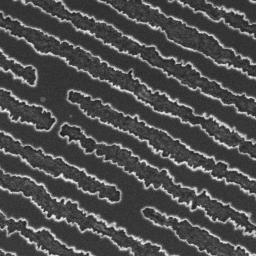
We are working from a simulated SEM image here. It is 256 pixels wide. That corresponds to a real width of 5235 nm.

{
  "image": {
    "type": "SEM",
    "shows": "parallel lines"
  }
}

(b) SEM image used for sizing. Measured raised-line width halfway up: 406 nm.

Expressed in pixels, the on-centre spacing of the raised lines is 34.9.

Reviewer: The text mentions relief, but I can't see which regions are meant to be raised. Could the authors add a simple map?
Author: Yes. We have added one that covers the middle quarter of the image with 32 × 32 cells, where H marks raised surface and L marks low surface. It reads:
HHLLLLLLLLLHHHHHHHHHHHLLLLLLLLLL
HHHHHLLLLLLLLHHHHHHHHHHHHLLLLLLL
HHHHHHLLLLLLLLLLLHHHHHHHHHLLLLLL
HHHHHHHHHLLLLLLLLHHHHHHHHHHHLLLL
HHHHHHHHHHHLLLLLLLLHHHHHHHHHHLLL
HHHHHHHHHHHHHLLLLLLLHHHHHHHHHHHL
HHHHHHHHHHHHHHHLLLLLLLHHHHHHHHHH
HLLLLHHHHHHHHHHHHLLLLLLLHHHHHHHH
HLLLLLLHHHHHHHHHHHLLLLLLLLHHHHHH
HHLLLLLLLHHHHHHHHHHHLLLLLLLLHHHH
HHHHLLLLLLLHHHHHHHHHHHLLLLLLLLHH
HHHHHLLLLLLLHHHHHHHHHHHLLLLLLLLL
HHHHHHLLLLLLLLLHHHHHHHHHHHLLLLLL
HHHHHHHHHLLLLLLLLLLHHHHHHHHHHLLL
HHHHHHHHHLLLLLLLLLLLHHHHHHHHHHLL
LLHHHHHHHHHHLLLLLLLLLHHHHHHHHHHH
LLLLHHHHHHHHHHLLLLLLLLLLHHHHHHHH
LLLLLHHHHHHHHHHHHLLLLLLLLLHHHHHH
HLLLLLLHHHHHHHHHHHHLLLLLLLLHHHHH
HHHHLLLLHHHHHHHHHHHHHLLLLLLLLHHH
HHHHLLLLLLLLLLHHHHHHHHLLLLLLLLHH
HHHHHLLHLLLLLLLLHHHHHHHLLLLLLLLL
HHHHHHHHLLLLLLLLLHHHHHHHLLLLLLLL
HHHHHHHHHHLLLLLLLLHHHHHHHHHLLLLL
HHHHHHHHHHHHLLLLLLLLHHHHHHHHLLLL
LLHHHHHHHHHHHHLLLLLLLLHHHHHHHHHL
LLLLHHHHHHHHHHHLLLLLLLLHHHHHHHHH
LLLLLLHHHHHHHHHHHHLLLLLLLLHHHHHH
LLLLLLLLHHHHHHHHHHHLLLLLLLLHHHHH
HHHLLLLLLHHHHHHHHHHHLLLLLLLHHHHH
HHHLLLLLLLLLHHHHHHHHLHLLLLLLLHHH
HHHHHLLLLLLLLHHHHHHHHHHHHLLLLLLL